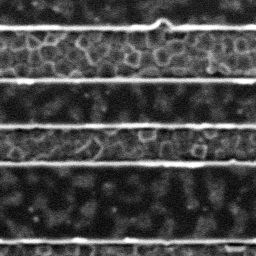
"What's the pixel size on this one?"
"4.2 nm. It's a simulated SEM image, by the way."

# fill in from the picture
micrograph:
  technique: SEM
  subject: one or a few lines or trenches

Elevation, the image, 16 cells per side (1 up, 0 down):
1111111111111111
1111111111111111
0000000000000000
0000000000000000
0000000000000000
1111111111111111
1111111111111111
1111111111111111
0000000000000000
0000000000000000
1111111111111111
1111111111111111
1111111111111111
1111111111111111
1111111111111111
0000000000000000